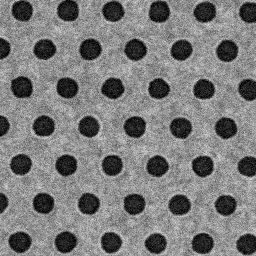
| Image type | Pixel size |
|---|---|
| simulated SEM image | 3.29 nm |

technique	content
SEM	a regular array of holes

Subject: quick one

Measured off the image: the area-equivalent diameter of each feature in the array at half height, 76.8 nanometres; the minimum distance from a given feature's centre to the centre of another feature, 147 nm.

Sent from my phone